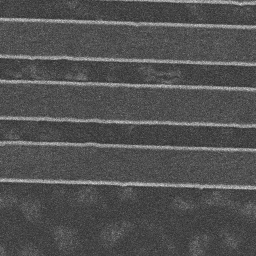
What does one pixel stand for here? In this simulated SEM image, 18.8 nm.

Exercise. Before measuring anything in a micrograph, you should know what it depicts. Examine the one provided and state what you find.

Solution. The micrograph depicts one or a few lines or trenches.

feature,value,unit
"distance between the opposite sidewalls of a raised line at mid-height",716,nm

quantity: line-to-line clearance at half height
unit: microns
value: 0.443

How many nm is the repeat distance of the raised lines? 1160